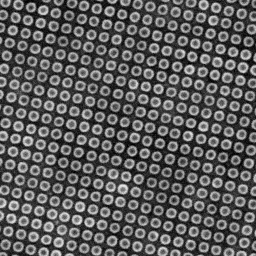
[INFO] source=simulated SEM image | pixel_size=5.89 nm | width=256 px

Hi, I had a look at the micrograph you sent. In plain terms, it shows a regular array of raised bodies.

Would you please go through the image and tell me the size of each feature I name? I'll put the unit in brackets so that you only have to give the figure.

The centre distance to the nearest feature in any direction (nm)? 74.9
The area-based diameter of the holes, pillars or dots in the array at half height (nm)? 55.2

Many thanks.